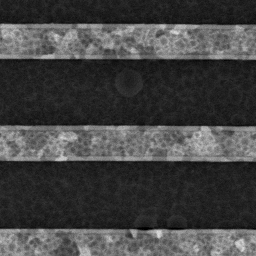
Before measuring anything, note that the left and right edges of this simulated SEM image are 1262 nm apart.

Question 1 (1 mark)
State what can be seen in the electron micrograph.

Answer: one or a few lines or trenches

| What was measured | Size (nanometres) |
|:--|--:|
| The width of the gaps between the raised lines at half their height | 351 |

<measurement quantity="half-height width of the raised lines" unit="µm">0.155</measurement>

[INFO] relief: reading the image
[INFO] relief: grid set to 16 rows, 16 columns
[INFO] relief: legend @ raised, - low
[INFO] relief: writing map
----------------
----------------
@@@@@@@@@@@@@@@@
@@@@@@@@@@@@@@@@
----------------
----------------
----------------
----------------
@@@@@@@@@@@@@@@@
@@@@@@@@@@@@@@@@
----------------
----------------
----------------
----------------
@@@@@@@@@@@@@@@@
@@@@@@@@@@@@@@@@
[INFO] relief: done